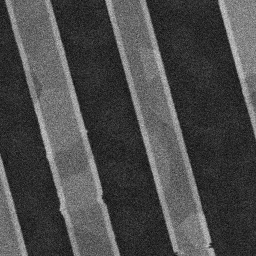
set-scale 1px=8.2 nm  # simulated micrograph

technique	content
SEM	one or a few lines or trenches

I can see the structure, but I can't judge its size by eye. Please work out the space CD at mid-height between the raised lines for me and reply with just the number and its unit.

476 nm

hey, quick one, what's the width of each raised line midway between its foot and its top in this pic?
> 0.293 µm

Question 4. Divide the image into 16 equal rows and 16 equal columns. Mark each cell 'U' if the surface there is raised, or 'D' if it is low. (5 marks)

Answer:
DUUDDDDUUDDDDDUU
DUUDDDDUUDDDDDUU
DUUUDDDUUUDDDDUU
DUUUDDDDUUDDDDDU
DDUUDDDDUUDDDDDU
DDUUDDDDUUDDDDDU
DDUUUDDDUUUDDDDD
DDDUUDDDDUUDDDDD
DDDUUDDDDUUDDDDD
DDDUUUDDDUUUDDDD
DDDUUUDDDDUUDDDD
DDDDUUDDDDUUDDDD
UDDDUUDDDDUUDDDD
UDDDUUUDDDUUUDDD
UDDDUUUDDDDUUDDD
UDDDDUUDDDDUUDDD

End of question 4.